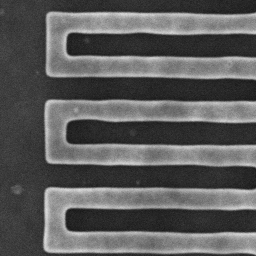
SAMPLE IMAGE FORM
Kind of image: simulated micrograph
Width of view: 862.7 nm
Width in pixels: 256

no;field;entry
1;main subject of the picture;groups of lines, slits or small figures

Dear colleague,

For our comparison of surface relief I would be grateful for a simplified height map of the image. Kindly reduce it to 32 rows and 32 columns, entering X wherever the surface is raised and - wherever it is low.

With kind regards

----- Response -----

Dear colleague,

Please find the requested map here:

--------------------------------
--------------------------------
------XXXXXXXXXXXXXXXXXXXXXXXXXX
------XXXXXXXXXXXXXXXXXXXXXXXXXX
------XXX-----------------------
------XX------------------------
------XX------------------------
------XXXXXXXXXXXXXXXXXXXXXXXXXX
------XXXXXXXXXXXXXXXXXXXXXXXXXX
------XXXXXXXXXXXXXXXXXXXXXXXXXX
--------------------------------
--------------------------------
--------------------------------
------XXXXXXXXXXXXXXXXXXXXXXXXXX
------XXXXXXXXXXXXXXXXXXXXXXXXXX
------XX------------------------
------XX------------------------
------XX------------------------
------XXXXXXXXXXXXXXXXXXXXXXXXXX
------XXXXXXXXXXXXXXXXXXXXXXXXXX
--------XXXXXXXXXXXXXXXXXXXXXXXX
--------------------------------
--------------------------------
------XX----XX-----XX-----------
------XXXXXXXXXXXXXXXXXXXXXXXXXX
------XXXXXXXXXXXXXXXXXXXXXXXXXX
------XX------------------------
------XX------------------------
------XX------------------------
------XXXXXXXXXXXXXXXXXXXXXXXXXX
-----XXXXXXXXXXXXXXXXXXXXXXXXXXX
------XXXXXXXXXXXXXXXXXXXXXXXXXX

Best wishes